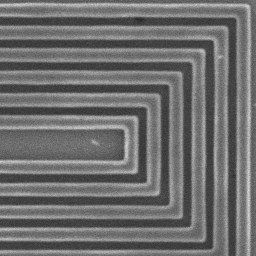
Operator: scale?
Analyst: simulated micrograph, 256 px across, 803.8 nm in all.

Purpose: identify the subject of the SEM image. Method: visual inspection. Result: groups of lines, slits or small figures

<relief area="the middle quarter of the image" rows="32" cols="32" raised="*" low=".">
................................
................................
******************************..
******************************..
******************************..
..........................****..
...........................***..
*********************......***..
************************...***..
************************...***..
************************...***..
.....................***...***..
.....................***...***..
******************...***...***..
******************...***...***..
******************...***...***..
...............***...***...***..
...............***...***...***..
...............***...***...***..
...............***...***..****..
...............***...***..****..
...............***...***..****..
...............***...***..****..
...............***...***..****..
******************...***..****..
******************...***..****..
******************...***..****..
.....................***..****..
.....................***..****..
.....................***..****..
************************...***..
************************...***..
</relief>